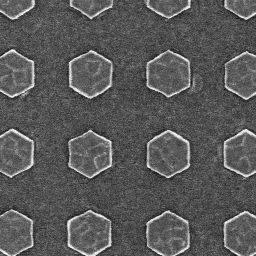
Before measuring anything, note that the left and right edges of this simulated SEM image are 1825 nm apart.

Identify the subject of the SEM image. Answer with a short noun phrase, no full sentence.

raised bodies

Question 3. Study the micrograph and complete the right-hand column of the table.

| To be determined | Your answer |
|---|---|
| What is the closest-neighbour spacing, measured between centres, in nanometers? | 560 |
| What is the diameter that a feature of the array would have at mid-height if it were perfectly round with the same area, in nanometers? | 312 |